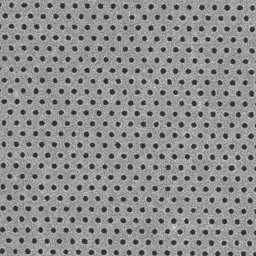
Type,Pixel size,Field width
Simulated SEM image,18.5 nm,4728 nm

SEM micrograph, a regular array of holes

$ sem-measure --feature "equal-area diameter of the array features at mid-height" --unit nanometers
108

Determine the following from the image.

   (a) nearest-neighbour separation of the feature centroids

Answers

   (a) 224 nanometers